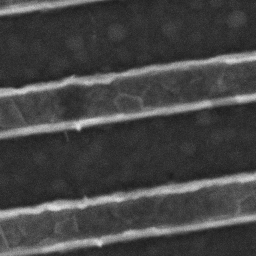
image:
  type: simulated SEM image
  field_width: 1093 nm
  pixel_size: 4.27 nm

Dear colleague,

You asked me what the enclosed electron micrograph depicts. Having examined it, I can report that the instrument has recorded one or a few lines or trenches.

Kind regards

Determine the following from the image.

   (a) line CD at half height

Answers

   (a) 42.5 pixels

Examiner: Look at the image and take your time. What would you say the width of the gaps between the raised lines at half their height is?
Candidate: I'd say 328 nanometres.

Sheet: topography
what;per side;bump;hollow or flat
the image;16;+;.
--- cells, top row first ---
++..............
................
................
...............+
.........+++++++
..++++++++++++++
+++++++++++++...
+++++++.........
................
................
................
............++++
......++++++++++
++++++++++++++++
++++++++++......
+++.............